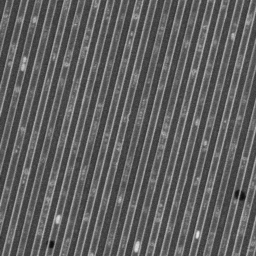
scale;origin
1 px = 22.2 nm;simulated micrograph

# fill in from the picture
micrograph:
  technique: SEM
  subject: parallel lines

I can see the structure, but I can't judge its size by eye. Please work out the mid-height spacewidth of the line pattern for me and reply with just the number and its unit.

0.157 micrometres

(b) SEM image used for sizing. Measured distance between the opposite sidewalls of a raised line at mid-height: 157 nanometers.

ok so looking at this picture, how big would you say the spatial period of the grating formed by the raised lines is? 310 nm